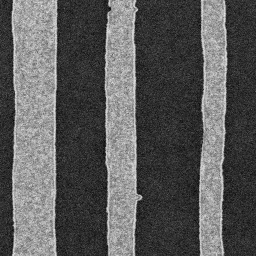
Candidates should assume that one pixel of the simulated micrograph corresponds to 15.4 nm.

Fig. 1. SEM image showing one or a few lines or trenches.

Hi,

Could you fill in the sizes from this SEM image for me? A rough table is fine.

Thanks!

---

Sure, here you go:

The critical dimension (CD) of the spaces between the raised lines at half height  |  872 nm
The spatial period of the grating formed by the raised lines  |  1.37 micrometres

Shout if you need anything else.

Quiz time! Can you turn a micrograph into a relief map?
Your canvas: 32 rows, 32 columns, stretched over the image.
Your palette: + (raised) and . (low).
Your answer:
..+++.+.......+++........+++....
..+++++.......+++........+++....
..+++++.......+++........+++....
..+++++......++++........+++....
..+.+++......++++........+++....
..+++++......++++........+++....
..+++++......++++.........++....
..+++++......++++.........++....
..+++++......++++.........++....
..+++++......++++.........++....
..+++++......++++.........++....
..+++++......++++........+++....
..+++++......++++........+++....
..+++++......++++........+++....
..+++++......++++........+++....
..+++++......++++........+++....
..+++++......++.+........+++....
..+++++......++..........+++....
..+++++.......+++........+++....
..+++++.......+++........+++....
..+++++......++++........+++....
..+++++.......+++........+++....
..+++++.......+++........+++....
..+++++.......+++........+++....
..+++++.......+++........+++....
..+++++.......+++........+++....
..+++++.......+++........+++....
..+.+++.......+++.........++....
..+++++.......+++........+++....
..+++++.......+++........+++....
..+++++.......+++........+++....
..++..+.......+++........+++....